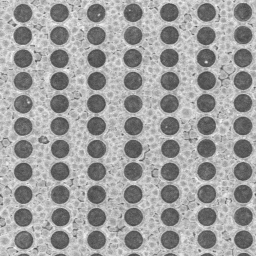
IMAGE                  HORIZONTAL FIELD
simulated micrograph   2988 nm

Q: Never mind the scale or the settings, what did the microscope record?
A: a regular array of holes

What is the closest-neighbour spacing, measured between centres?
263 nanometers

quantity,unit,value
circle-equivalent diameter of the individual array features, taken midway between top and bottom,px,19.2